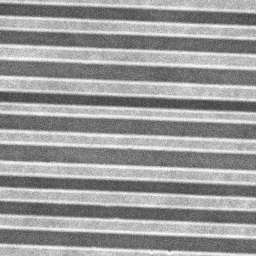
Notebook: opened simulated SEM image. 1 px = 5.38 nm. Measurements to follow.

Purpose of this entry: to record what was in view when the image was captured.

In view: parallel lines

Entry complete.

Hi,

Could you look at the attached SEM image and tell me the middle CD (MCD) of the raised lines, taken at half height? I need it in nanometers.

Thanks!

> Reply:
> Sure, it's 68.5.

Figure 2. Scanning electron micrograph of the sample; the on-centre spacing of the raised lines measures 0.152 micrometres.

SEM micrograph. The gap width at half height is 0.0819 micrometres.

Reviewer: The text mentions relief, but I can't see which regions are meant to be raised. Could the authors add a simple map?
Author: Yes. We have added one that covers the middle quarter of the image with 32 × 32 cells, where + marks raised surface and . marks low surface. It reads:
..............................++
................................
................................
................................
++++++++++++++..................
++++++++++++++++++++++++++++++++
++++++++++++++++++++++++++++++++
....++++++++++++++++++++++++++++
.............................+++
................................
..+++...........................
++++++++++++++++++++++++++++++..
++++++++++++++++++++++++++++++++
................++++++++++++++++
................................
................................
................................
+++++...........................
++++++++++++++++++++++++++++++..
++++++++++++++++++++++++++++++++
......++++++++++++++++++++++++++
...............................+
................................
................................
................................
+++++++++.++++..................
++++++++++++++++++++++++++++++++
++++++++++++++++++++++++++++++++
..........++++++++++++++++++++++
................................
................................
................................